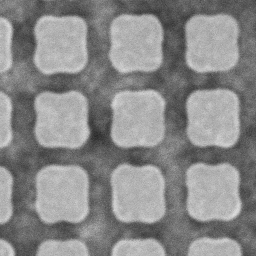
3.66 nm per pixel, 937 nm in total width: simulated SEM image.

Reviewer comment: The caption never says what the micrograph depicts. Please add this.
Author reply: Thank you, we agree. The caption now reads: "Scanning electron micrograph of a regular array of raised bodies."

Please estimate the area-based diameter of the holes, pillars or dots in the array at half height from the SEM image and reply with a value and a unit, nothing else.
58.4 pixels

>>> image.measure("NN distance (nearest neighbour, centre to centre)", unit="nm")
274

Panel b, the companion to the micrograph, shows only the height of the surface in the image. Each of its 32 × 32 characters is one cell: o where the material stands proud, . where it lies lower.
................................
................................
o....ooooo....oooooo....ooooo...
o...ooooooo...oooooo...ooooooo..
o...ooooooo...oooooo...ooooooo..
o....oooooo...oooooo...ooooooo..
o....oooooo...oooooo...ooooooo..
o...ooooooo...oooooo...ooooooo..
o....ooooo.....ooooo....ooooo...
................................
................................
........o......o........ooooo...
o...ooooooo...oooooo....oooooo..
o...ooooooo...oooooo...ooooooo..
o....oooooo...oooooo...ooooooo..
o....oooooo...oooooo...ooooooo..
o...ooooooo...oooooo...ooooooo..
o....oooooo...oooooo....oooooo..
................................
................................
................................
o....oooooo...oooooo....oooooo..
o....oooooo...oooooo...ooooooo..
o....oooooo...oooooo...ooooooo..
o....oooooo...oooooo...ooooooo..
o....oooooo...ooooooo..ooooooo..
o....oooooo...ooooooo...oooooo..
o....ooooo.....ooooo.....o......
................................
................................
o....ooooo.....ooooo....oooooo..
oo...oooooo...oooooo....oooooo..